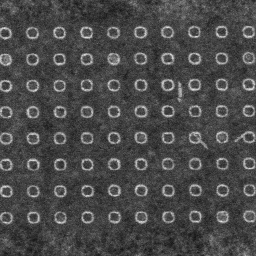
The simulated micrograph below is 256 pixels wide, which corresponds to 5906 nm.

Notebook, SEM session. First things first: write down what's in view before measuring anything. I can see a regular array of raised bodies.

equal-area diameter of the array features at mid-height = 262 nanometres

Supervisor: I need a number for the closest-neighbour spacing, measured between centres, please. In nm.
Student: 606